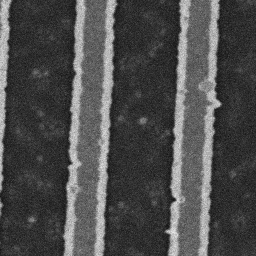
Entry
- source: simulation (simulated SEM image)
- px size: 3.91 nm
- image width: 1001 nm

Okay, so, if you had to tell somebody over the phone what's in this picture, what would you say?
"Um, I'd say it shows one or a few lines or trenches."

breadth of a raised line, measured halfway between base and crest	117	nm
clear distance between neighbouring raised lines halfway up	74	pixels